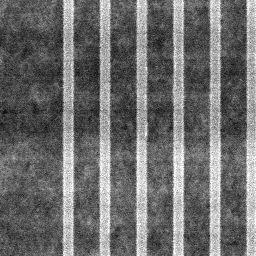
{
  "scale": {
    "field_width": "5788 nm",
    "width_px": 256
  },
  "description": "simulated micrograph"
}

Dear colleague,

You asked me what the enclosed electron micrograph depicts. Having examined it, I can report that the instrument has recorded parallel lines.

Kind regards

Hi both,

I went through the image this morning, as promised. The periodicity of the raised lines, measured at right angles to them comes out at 830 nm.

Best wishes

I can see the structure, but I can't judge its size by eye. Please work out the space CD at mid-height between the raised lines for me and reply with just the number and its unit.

633 nanometers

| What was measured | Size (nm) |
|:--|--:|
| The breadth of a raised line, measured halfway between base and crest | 201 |